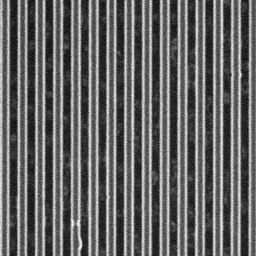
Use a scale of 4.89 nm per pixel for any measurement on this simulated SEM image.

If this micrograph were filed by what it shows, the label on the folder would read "parallel lines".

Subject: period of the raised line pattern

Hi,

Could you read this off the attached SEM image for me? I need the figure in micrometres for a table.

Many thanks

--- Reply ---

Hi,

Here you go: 0.0869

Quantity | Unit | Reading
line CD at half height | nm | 37.9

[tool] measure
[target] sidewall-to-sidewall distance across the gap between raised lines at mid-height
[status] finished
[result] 48.3 nanometres